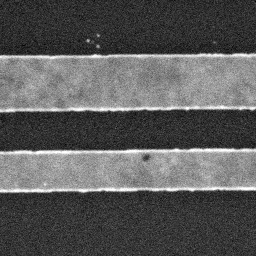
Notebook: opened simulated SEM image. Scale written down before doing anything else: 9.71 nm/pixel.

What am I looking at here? lines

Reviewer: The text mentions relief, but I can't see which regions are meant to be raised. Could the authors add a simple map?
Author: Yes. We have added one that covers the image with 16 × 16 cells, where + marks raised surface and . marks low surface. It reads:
................
................
................
.....+++++++++++
++++++++++++++++
++++++++++++++++
++++++++++++++++
................
................
.+++++++++++++++
++++++++++++++++
++++++++++++++++
................
................
................
................